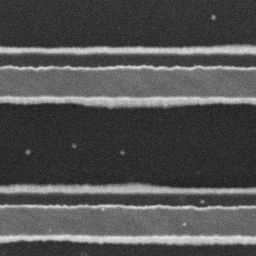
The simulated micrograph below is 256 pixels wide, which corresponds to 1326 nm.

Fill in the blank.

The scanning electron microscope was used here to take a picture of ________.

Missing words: lines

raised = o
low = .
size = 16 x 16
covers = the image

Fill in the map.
................
................
................
oooooooooooooooo
oooooooooooooooo
oooooooooooooooo
................
................
................
................
................
................
oooooooooooooooo
oooooooooooooooo
oooooooooooooooo
................